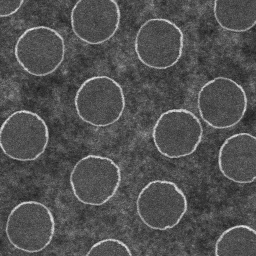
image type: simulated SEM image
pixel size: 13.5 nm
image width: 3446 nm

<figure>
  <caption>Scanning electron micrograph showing a regular array of raised bodies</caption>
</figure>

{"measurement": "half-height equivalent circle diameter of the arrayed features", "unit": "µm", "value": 0.658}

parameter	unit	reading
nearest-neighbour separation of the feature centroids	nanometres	1000